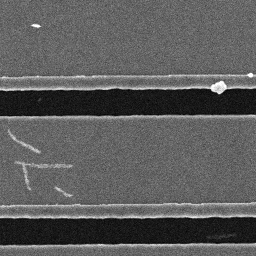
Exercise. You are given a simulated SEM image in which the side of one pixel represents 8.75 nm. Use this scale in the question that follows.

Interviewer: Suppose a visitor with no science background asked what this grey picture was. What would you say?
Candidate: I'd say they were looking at lines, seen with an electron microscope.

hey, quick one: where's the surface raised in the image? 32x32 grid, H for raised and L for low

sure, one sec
HHHHHHHHHHHHHHHHHHHHHHHHHHHHHHHH
HHHHHHHHHHHHHHHHHHHHHHHHHHHHHHHH
HHHHHHHHHHHHHHHHHHHHHHHHHHHHHHHH
HHHHHHHHHHHHHHHHHHHHHHHHHHHHHHHH
HHHHHHHHHHHHHHHHHHHHHHHHHHHHHHHH
HHHHHHHHHHHHHHHHHHHHHHHHHHHHHHHH
HHHHHHHHHHHHHHHHHHHHHHHHHHHHHHHH
HHHHHHHHHHHHHHHHHHHHHHHHHHHHHHHH
HHHHHHHHHHHHHHHHHHHHHHHHHHHHHHHH
HHHHHHHHHHHHHHHHHHHHHHHHHHHHHHHH
HHHHHHHHHHHHHHHHHHHHHHHHHHHHHHHH
LLLLLLLLLLLLLLLLLLLLLLLLLLLHLLLL
LLLLLLLLLLLLLLLLLLLLLLLLLLLLLLLL
LLLLLLLLLLLLLLLLLLLLLLLLLLLLLLLL
LLLLLLLLHHHHHHLHHHHHHHHHHHHHHHHH
HHHHHHHHHHHHHHHHHHHHHHHHHHHHHHHH
HHHHHHHHHHHHHHHHHHHHHHHHHHHHHHHH
HHHHHHHHHHHHHHHHHHHHHHHHHHHHHHHH
HHHHHHHHHHHHHHHHHHHHHHHHHHHHHHHH
HHHHHHHHHHHHHHHHHHHHHHHHHHHHHHHH
HHHHHHHHHHHHHHHHHHHHHHHHHHHHHHHH
HHHHHHHHHHHHHHHHHHHHHHHHHHHHHHHH
HHHHHHHHHHHHHHHHHHHHHHHHHHHHHHHH
HHHHHHHHHHHHHHHHHHHHHHHHHHHHHHHH
HHHHHHHHHHHHHHHHHHHHHHHHHHHHHHHH
HHHHHHHHHHHHHHHHHHHHHHHHHHHHHHHH
HHHHHHHHHHHHHHHHHHHHHHHHHHHHHHHH
LLLLLLLLLLLLLLLLLLLLLLLLLLLLLLLL
LLLLLLLLLLLLLLLLLLLLLLLLLLLLLLLL
LLLLLLLLLLLLLLLLLLLLLLLLLLLLLLLL
LLLLLLLLLLLLLLLLLLLLLLLHHHHLHLLH
HHHHHHHHHHHHHHHHHHHHHHHHHHHHHHHH